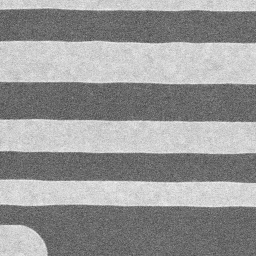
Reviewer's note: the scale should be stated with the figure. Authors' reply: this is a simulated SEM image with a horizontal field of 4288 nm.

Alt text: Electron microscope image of groups of lines, slits or small figures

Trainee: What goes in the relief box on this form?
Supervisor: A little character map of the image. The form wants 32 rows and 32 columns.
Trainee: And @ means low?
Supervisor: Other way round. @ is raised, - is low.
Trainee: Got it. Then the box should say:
@@@@@@@@@@@@@@@@@@@@@@@@@@@@@@@@
--------------------------------
--------------------------------
--------------------------------
--------------------------------
@@@@@@@@@@@@@@@@@@---@@@-@@@@---
@@@@@@@@@@@@@@@@@@@@@@@@@@@@@@@@
@@@@@@@@@@@@@@@@@@@@@@@@@@@@@@@@
@@@@@@@@@@@@@@@@@@@@@@@@@@@@@@@@
@@@@@@@@@@@@@@@@@@@@@@@@@@@@@@@@
--------------------------------
--------------------------------
--------------------------------
--------------------------------
--------------------------------
@@@@@@@@@@@@@@@@@@@@@@@@@@@@@@@@
@@@@@@@@@@@@@@@@@@@@@@@@@@@@@@@@
@@@@@@@@@@@@@@@@@@@@@@@@@@@@@@@@
@@@@@@@@@@@@@@@@@@@@@@@@@@@@@@@@
--------------------------------
--------------------------------
--------------------------------
--------------------------------
@@@@@@@@@@@@@@@@@@@@@@@@@@@@@@@@
@@@@@@@@@@@@@@@@@@@@@@@@@@@@@@@@
-@@@@@@----@@@@@@@@@@@@@@@@@@@@@
--------------------------------
--------------------------------
@@@@----------------------------
@@@@@---------------------------
@@@@@@--------------------------
@@@@@@--------------------------